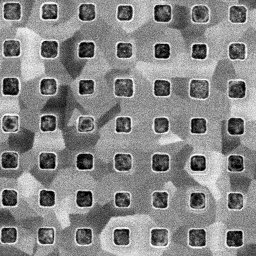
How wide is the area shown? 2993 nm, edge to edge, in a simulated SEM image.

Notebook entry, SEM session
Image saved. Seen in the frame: a regular array of holes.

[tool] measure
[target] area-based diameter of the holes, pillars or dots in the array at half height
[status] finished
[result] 0.211 µm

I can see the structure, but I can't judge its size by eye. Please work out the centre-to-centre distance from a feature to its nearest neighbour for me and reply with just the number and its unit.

435 nanometres